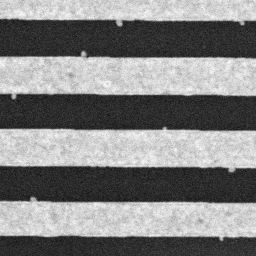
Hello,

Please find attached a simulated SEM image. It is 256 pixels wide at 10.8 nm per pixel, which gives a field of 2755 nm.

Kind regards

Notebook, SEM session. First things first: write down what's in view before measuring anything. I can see lines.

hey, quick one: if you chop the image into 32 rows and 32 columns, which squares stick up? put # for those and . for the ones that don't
################################
################################
................................
................................
................................
................................
................................
################################
################################
################################
################################
################################
................................
................................
................................
................................
################################
################################
################################
################################
################################
................................
................................
................................
................................
################################
################################
################################
################################
................................
................................
................................